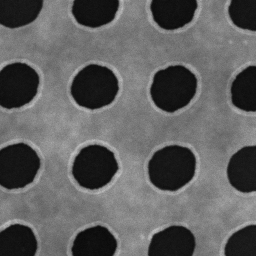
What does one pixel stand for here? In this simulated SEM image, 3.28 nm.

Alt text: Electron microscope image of holes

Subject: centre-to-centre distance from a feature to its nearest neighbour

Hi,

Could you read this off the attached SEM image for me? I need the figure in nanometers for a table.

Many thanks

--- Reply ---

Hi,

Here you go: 256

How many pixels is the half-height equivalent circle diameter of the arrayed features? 45.9